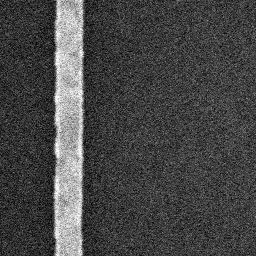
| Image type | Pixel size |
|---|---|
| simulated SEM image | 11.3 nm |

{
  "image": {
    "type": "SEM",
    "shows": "one or a few lines or trenches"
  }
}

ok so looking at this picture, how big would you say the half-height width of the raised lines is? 0.267 micrometres